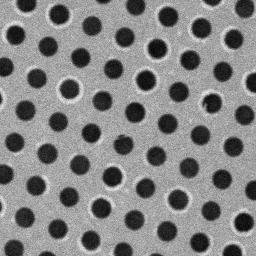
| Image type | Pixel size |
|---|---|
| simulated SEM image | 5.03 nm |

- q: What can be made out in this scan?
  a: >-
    a regular array of holes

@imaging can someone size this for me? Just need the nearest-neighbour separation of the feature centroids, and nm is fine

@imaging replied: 170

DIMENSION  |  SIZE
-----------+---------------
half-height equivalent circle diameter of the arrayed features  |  102 nanometres